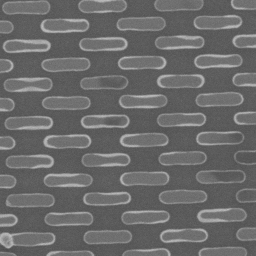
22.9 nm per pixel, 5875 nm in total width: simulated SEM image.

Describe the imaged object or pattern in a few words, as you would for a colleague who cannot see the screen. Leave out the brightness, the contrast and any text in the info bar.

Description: groups of lines, slits or small figures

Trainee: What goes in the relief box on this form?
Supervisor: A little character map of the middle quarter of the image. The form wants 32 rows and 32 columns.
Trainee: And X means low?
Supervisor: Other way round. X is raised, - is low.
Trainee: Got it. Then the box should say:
XXXXXX--------XXXXXXXXXXX-------
XXXXX---------------------------
--------------------------------
-------XXXXXXXX---------XXXXXXXX
----XXXXXXXXXXXX--------XXXXXXXX
----XXXXXXXXXXXX--------XXXXXXXX
--------------------------------
--------------------------------
XXXXXX--------XXXXXXXXXXXX------
XXXXXX--------XXXXXXXXXXXX------
XXXXXX---------XXXXXXXXXX-------
--------------------------------
----------------------------XX--
-----XXXXXXXXXXX--------XXXXXXXX
-----XXXXXXXXXXX--------XXXXXXXX
-----XXX------X-----------------
--------------------------------
-------------------XXXXXX-------
XXXXXX--------XXXXXXXXXXXX------
XXXXXX--------XXXXXXXXXXXX------
XXXXXX------------XXXX----------
--------------------------------
--------------------------XXXXXX
-----XXXXXXXXXXX--------XXXXXXXX
-----XXXXXXXXXXX--------XXXXXXXX
--------------------------------
--------------------------------
---------------XXXXXXXXXXX------
XXXXXXX-------XXXXXXXXXXXX------
XXXXXXX-------XXXXXXXXXXXX------
--------------------------------
--------------------------------